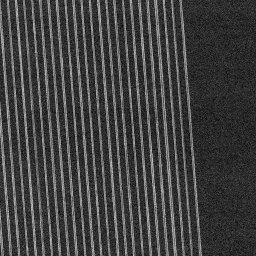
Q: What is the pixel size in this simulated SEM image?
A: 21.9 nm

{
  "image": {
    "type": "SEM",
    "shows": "parallel lines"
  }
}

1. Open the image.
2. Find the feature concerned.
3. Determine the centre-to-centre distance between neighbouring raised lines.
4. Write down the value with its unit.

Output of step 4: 179 nm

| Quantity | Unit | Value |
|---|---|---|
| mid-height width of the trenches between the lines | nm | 142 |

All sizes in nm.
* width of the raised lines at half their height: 32.7